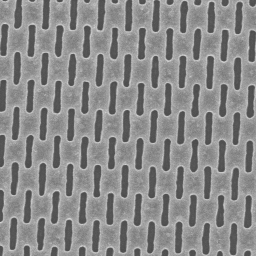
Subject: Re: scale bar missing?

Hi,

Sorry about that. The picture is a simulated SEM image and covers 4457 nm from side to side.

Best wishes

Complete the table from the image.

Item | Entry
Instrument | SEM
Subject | a regular array of holes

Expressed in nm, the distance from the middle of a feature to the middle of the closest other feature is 478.